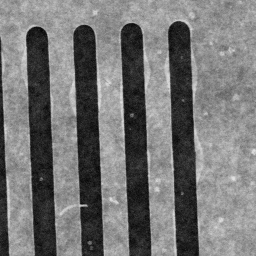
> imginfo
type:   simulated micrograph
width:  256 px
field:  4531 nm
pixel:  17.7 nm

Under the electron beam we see groups of lines, slits or small figures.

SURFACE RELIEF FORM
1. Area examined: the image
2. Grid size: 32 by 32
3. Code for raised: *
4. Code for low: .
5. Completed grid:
********************************
********************************
********************************
****.*****.****...***...********
***...***...***...***...********
***...***...***...***...********
***...***...***...***...********
***...***...***...***...********
***...***...***...***...********
***...***...***...***...********
***...***...***...***...********
***...***...***...***...********
***...***...***...***...********
***....**...***...***...********
****...**...***...***...********
.***...**...***...***...********
.***...***..***...***...********
.***...***...**...***....*******
.***...***...***..***....*******
.***...***...***...**....*******
.***...***...***...***...*******
.***...***...***...***...*******
.***...***...***...***...*******
.***...***...***...***...*******
.***...***...***...***...*******
.***...***...***...***...*******
.***...***...***...***...*******
.***...***...***...***...*******
.***...***...***...***...*******
.***...***...***...***...*******
.***...***...***...***...*******
.***...***...***...***...*******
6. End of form